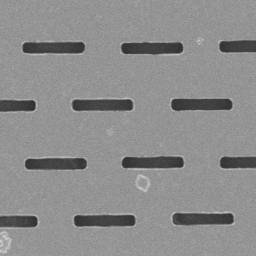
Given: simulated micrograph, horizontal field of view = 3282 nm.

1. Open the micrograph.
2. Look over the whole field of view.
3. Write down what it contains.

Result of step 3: a regular array of holes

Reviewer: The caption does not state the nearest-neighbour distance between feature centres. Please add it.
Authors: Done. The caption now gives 964 nm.